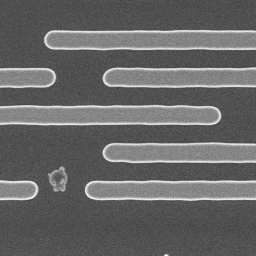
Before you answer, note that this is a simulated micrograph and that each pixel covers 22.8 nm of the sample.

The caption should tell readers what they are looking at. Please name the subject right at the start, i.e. groups of lines, slits or small figures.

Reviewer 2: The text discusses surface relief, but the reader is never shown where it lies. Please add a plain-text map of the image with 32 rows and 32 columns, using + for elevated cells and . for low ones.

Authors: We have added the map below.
................................
................................
................................
................................
......++++++++++++++++++++++++++
......++++++++++++++++++++++++++
................................
................................
................................
+++++++......+++++++++++++++++++
++++++.......+++++++++++++++++++
................................
................................
+++++++++++++++++++++++++++.....
++++++++++++++++++++++++++++....
................................
................................
................................
.............+++++++++++++++++++
.............+++++++++++++++++++
................................
................................
................................
+++++......+++++++++++++++++++++
++++.......+++++++++++++++++++++
................................
................................
................................
................................
................................
................................
................................